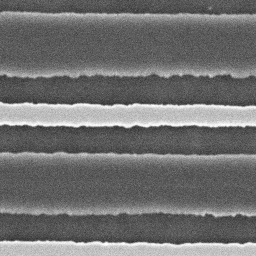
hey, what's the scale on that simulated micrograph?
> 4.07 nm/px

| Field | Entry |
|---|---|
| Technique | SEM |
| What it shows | lines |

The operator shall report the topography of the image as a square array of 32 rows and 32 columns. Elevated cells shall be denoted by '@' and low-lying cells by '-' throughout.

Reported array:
--------------------------------
--------------------------------
@@@@@@@@@@@@@@@@@@@@@@@@@@@@@@@@
@@@@@@@@@@@@@@@@@@@@@@@@@@@@@@@@
@@@@@@@@@@@@@@@@@@@@@@@@@@@@@@@@
@@@@@@@@@@@@@@@@@@@@@@@@@@@@@@@@
@@@@@@@@@@@@@@@@@@@@@@@@@@@@@@@@
@@@@@@@@@@@@@@@@@@@@@@@@@@@@@@@@
@@@@@@@@@@@@@@@@@@@@@@@@@@@@@@@@
--@@@@---@-------------------@@-
--------------------------------
--------------------------------
--------------------------------
@@@@@@@@@@@@@@@@@@@@@@@@@@@@@@@@
@@@@@@@@@@@@@@@@@@@@@@@@@@@@@@@@
@@@@@@@@@@@@@@@@@@@@@@@@@@@@@@@@
--------------------------------
--------------------------------
--------------------------------
@@@@@@@@@@@@@@@@@@@@@@@-@--@@@@@
@@@@@@@@@@@@@@@@@@@@@@@@@@@@@@@@
@@@@@@@@@@@@@@@@@@@@@@@@@@@@@@@@
@@@@@@@@@@@@@@@@@@@@@@@@@@@@@@@@
@@@@@@@@@@@@@@@@@@@@@@@@@@@@@@@@
@@@@@@@@@@@@@@@@@@@@@@@@@@@@@@@@
@@@@@@@@@@@@@@@@@@@@@@@@@@@@@@@@
-@@@@@@@@@@@@@@-@@---@@@@@@@@@@@
--------------------------------
--------------------------------
--------------------------------
@@@@@@@@@@@@@@@@@@@@@--@@@@@@@@@
@@@@@@@@@@@@@@@@@@@@@@@@@@@@@@@@